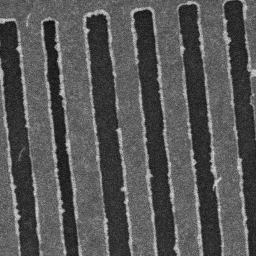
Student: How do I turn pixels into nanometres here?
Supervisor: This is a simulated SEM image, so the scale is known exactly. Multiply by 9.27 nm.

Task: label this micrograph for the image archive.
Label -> parallel lines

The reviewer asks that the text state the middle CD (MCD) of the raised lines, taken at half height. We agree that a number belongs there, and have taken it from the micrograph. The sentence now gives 247 nm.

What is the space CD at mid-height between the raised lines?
175 nm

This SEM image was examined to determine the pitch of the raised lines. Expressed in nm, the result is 421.